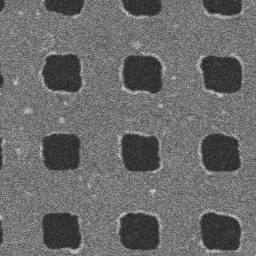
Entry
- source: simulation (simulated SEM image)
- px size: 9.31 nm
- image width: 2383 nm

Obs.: a regular array of holes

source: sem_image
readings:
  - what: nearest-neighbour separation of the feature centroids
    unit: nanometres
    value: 736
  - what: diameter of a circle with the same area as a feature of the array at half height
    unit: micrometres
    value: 0.38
